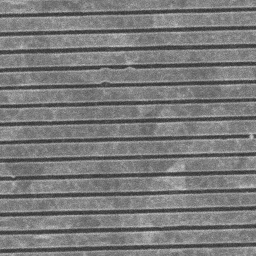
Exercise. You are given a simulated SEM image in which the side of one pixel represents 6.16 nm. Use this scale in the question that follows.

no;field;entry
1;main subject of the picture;parallel lines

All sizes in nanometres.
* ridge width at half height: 80.9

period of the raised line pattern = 111 nanometers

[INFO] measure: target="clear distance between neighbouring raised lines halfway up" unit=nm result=32.3